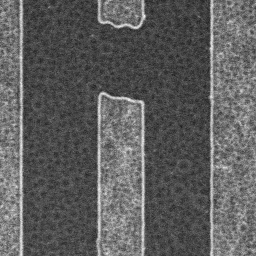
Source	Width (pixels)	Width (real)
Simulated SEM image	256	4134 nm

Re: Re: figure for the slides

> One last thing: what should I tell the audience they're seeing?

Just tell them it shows one or a few lines or trenches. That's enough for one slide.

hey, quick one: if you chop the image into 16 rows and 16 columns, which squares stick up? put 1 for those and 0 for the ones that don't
1000001110000111
1000000110000111
1000000000000111
1000000000000111
1000000000000111
1000000000000111
1000001110000111
1000001110000111
1000001110000111
1000001110000111
1000001110000111
1000001110000111
1000001110000111
1000001110000111
1000001110000111
1000001110000111